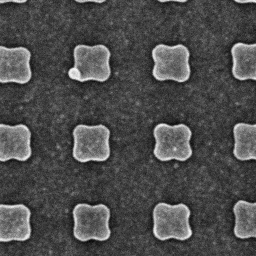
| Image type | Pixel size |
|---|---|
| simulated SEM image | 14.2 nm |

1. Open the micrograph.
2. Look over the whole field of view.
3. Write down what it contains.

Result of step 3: raised bodies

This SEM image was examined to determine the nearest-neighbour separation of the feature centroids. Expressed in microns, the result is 1.12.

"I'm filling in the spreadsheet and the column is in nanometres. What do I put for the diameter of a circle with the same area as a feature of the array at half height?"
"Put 543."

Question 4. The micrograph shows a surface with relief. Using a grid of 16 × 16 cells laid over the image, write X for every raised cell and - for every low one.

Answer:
----------------
----------------
----------------
XX---XX---XX---X
XX--XXX---XX---X
----------------
----------------
----------------
XX---XX---XX---X
XX---XX---XX---X
----------------
----------------
----------------
XX---XX---XX---X
XX---XX---XX---X
----------------